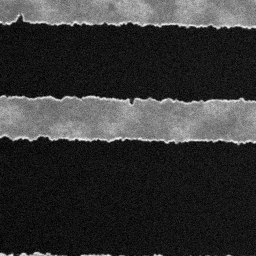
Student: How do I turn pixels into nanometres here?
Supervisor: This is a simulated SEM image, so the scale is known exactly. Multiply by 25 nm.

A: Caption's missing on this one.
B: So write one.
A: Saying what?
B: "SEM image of one or a few lines or trenches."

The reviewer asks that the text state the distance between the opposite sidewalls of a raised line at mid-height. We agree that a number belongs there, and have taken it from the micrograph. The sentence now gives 1010 nm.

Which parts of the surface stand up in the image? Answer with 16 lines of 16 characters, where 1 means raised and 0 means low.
1111111111111111
0001110111111111
0000000000000000
0000000000000000
0000000000000000
0000000000000000
1111111111111111
1111111111111111
1111111111111111
0000000000000000
0000000000000000
0000000000000000
0000000000000000
0000000000000000
0000000000000000
0000000000000000